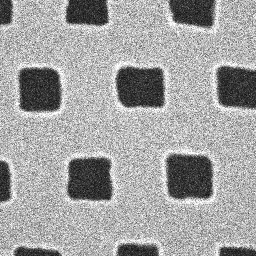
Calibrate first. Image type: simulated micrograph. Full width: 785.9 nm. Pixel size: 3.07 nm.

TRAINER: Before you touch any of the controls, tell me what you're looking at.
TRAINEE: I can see holes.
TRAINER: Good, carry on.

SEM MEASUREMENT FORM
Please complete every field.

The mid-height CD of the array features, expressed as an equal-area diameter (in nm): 150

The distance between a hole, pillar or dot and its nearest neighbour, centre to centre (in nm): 309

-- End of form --